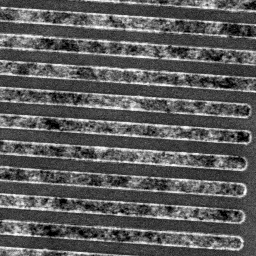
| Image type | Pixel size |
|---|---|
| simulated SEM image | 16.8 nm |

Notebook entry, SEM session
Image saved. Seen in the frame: parallel lines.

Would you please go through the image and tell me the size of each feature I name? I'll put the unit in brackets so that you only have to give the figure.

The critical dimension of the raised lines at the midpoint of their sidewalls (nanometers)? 216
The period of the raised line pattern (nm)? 447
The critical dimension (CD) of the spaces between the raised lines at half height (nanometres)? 233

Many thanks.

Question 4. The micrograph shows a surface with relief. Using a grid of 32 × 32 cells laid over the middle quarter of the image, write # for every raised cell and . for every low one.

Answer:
.#..............................
###############.................
##############################..
################################
.............#.#################
.............................###
................................
########........................
#######################.........
################################
....############################
...................#############
................................
................................
#############...................
###########################.....
################################
............####################
...........................#####
................................
###.............................
#################...............
################################
..##############################
.................###############
.............................#.#
................................
#######.........................
######################..........
################################
.......#########################
.....................###########